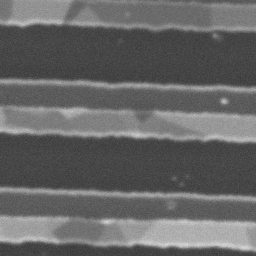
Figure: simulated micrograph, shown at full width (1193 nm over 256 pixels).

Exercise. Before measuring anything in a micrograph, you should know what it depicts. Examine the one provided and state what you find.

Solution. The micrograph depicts lines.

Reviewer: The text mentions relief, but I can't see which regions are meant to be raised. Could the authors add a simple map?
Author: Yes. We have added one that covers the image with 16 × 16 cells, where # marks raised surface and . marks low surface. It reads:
################
##..############
................
................
................
##############..
################
################
........########
................
................
................
################
################
################
..............##